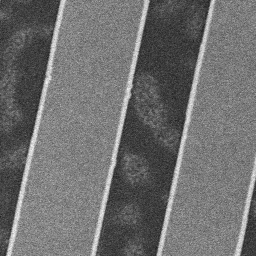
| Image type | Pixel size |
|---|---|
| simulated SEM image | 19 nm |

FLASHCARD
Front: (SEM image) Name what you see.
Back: one or a few lines or trenches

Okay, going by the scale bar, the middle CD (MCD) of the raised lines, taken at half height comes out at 1560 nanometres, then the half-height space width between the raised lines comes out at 1220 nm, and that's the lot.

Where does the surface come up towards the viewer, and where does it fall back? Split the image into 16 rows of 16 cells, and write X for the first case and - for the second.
----XXXXX----XXX
----XXXXX----XXX
---XXXXXX----XXX
---XXXXX-----XXX
---XXXXX----XXXX
---XXXXX----XXXX
---XXXXX----XXXX
--XXXXXX----XXXX
--XXXXX-----XXXX
--XXXXX----XXXXX
--XXXXX----XXXXX
--XXXXX----XXXXX
-XXXXXX----XXXXX
-XXXXX----XXXXX-
-XXXXX----XXXXX-
-XXXXX----XXXXX-